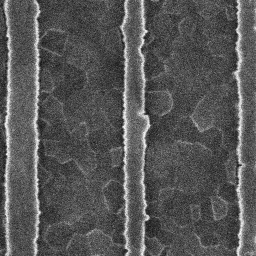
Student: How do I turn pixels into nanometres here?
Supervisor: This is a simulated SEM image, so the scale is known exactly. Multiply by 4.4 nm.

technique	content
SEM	one or a few lines or trenches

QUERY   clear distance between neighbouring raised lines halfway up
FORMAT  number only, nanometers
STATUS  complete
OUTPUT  394